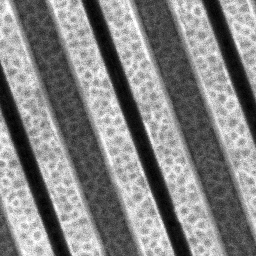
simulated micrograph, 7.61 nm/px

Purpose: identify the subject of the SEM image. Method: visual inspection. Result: parallel lines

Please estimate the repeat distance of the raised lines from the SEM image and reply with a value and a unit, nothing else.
432 nm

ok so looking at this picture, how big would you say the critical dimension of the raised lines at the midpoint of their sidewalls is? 0.235 microns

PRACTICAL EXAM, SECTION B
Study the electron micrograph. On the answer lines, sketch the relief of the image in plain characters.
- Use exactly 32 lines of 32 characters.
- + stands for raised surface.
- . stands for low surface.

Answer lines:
+.....++++..++++.....++++..+++++
++.....++++..++++.....++++..++++
++.....++++..++++.....++++..++++
++.....+++++.+++++.....++++..+++
+++.....++++..++++.....++++..+++
+++.....++++..++++.....++++..+++
++++.....++++..++++.....++++..++
++++.....++++..++++.....++++..++
++++.....++++..++++.....++++..++
+++++.....++++..++++.....++++..+
.++++.....++++..++++.....++++..+
.++++.....++++..++++.....+++++.+
..++++.....++++..++++.....++++..
..++++.....++++..++++.....++++..
+.+++++....+++++.+++++.....++++.
+..++++.....++++..++++.....++++.
+..++++.....++++..++++.....++++.
++.+++++.....++++.+++++.....++++
++..++++.....++++..++++.....++++
++..++++.....++++..++++.....++++
+++..++++.....++++..++++.....+++
+++..++++.....++++..++++.....+++
+++..++++.....+++++.+++++....+++
++++..++++.....++++..++++.....++
++++..++++.....++++..++++.....++
+++++.+++++....+++++..++++.....+
.++++..++++.....++++..++++.....+
.++++..++++.....++++..++++.....+
.+++++.+++++.....++++..++++.....
..++++..++++.....++++..++++.....
..++++..++++.....++++..++++.....
...++++..++++.....++++..++++....